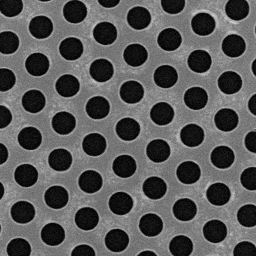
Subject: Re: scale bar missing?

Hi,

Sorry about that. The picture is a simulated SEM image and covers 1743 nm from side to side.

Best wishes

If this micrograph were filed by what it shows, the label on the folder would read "a regular array of holes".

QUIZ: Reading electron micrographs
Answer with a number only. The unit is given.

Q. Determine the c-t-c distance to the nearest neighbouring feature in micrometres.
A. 0.252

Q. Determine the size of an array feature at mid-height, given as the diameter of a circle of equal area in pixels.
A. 24.1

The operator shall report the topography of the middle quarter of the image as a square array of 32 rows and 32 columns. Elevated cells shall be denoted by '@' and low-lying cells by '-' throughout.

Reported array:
@@@@@@@-----@@@@@--@@@@@---@@@@-
@@@@@@------@@@@@@@@@@@-----@@@@
@@@@@@@-----@@@@@@@@@@------@@@@
---@@@@-----@@@@@@@@@@-------@@@
----@@@@--@@@@@----@@@@-----@@@@
----@@@@@@@@@@------@@@----@@@@@
----@@@@@@@@@@------@@@@@@@@@@@-
---@@@@@@@@@@@------@@@@@@@@@@--
@@@@@@@---@@@@------@@@@@@@@@@--
@@@@@@-----@@@@----@@@@@-@@@@@--
@@@@@------@@@@@@@@@@@-----@@@@-
@@@@@------@@@@@@@@@@@-----@@@@@
--@@@@-----@@@@@@@@@@-------@@@@
---@@@@---@@@@@--@@@@@-----@@@@@
---@@@@@@@@@@-----@@@@-----@@@@@
---@@@@@@@@@@------@@@@@@@@@@@--
--@@@@@@@@@@@------@@@@@@@@@@---
-@@@@@---@@@@------@@@@@@@@@@---
@@@@@-----@@@@----@@@@@@@@@@@---
@@@@@------@@@@@@@@@@-----@@@@--
@@@@@------@@@@@@@@@@-----@@@@@-
-@@@@-----@@@@@@@@@@-------@@@@@
--@@@@----@@@@@@@@@@@------@@@@@
--@@@@@@@@@@@----@@@@-----@@@@@@
--@@@@@@@@@@------@@@@---@@@@@--
--@@@@@@@@@@------@@@@@@@@@@@---
-@@@@@-@@@@@------@@@@@@@@@@----
@@@@-----@@@@----@@@@@@@@@@@----
@@@@------@@@@@-@@@@@---@@@@----
@@@-------@@@@@@@@@@-----@@@@---
@@@@-----@@@@@@@@@@@------@@@@@@
-@@@-----@@@@@@@@@@@------@@@@@@